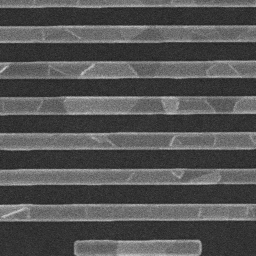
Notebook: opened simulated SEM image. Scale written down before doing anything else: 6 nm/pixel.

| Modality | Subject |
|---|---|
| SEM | wiring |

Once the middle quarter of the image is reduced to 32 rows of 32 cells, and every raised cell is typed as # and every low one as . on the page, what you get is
################################
################################
################################
................................
................................
................................
................................
................................
...........................#####
################################
################################
################################
................................
................................
................................
................................
................................
................................
################################
################################
################################
................................
................................
................................
................................
................................
................................
################################
################################
################################
................................
................................